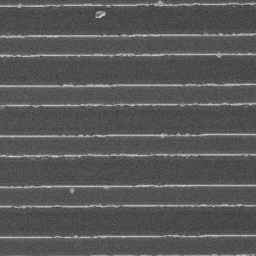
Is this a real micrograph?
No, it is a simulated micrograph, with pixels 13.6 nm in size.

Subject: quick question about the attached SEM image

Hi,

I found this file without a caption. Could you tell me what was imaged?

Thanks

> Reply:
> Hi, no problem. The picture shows lines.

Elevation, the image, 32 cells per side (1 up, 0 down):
11111111111111111111111111111111
00000000000000000000000000000000
00000000000000000000000000000000
00000000000000000000000000000000
00000000000001011111111111111111
11111111111111111111111111111111
11111111111111111111111111111111
00000000000000000000000000000000
00000000000000000000000000000000
00000000000000000000000000000000
00000000000000000000000000000000
11111111111111111111111111111111
11111111111111111111111111111111
00000000000000000000000000000000
00000000000000000000000000000000
00000000000000000000000000000000
00000000000000000000000000000000
11111111111111111111111111111111
11111111111111111111111111111111
11111111011000000000000000000000
00000000000000000000000000000000
00000000000000000000000000000000
00000000000000000000000000000000
11111111111111111111111111111111
11111111111111111111111111111111
11111111111111111111111111111111
00000000000000000000000000000000
00000000000000000000000000000000
00000000000000000000000000000000
00000000000000000000111001111111
11111111111111111111111111111111
11111111111111111111111111111111